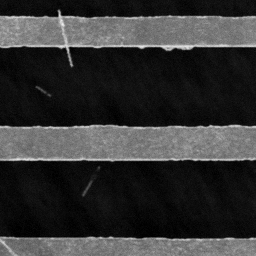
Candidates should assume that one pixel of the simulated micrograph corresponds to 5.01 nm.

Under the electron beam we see lines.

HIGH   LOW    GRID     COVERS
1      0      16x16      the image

0000000000000000
1111111111111111
1111111111111111
0000000000000000
0000000000000000
0000000000000000
0000000000000000
0000000000000000
1111111111111111
1111111111111111
0000000000000000
0000000000000000
0000000000000000
0000000000000000
0000000000000000
1111111111111111